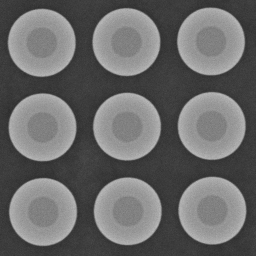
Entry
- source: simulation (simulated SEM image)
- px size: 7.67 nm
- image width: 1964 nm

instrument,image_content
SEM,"an array of small figures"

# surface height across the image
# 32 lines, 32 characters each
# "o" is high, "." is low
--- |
................................
....ooo.......oooo......oooo....
..oooooo.....oooooo....ooooooo..
.oooooooo...oooooooo...ooooooo..
.oooooooo...oooooooo..ooooooooo.
.oooooooo...oooooooo..ooooooooo.
.oooooooo...oooooooo..oooooooo..
..ooooooo...ooooooo....ooooooo..
..oooooo.....oooooo.....ooooo...
.....o..........................
................................
................................
...ooooo.....ooooo......ooooo...
..ooooooo...ooooooo....ooooooo..
.oooooooo...oooooooo..oooooooo..
.ooooooooo..oooooooo..ooooooooo.
.oooooooo...oooooooo..ooooooooo.
.oooooooo...oooooooo...ooooooo..
..ooooooo....oooooo....ooooooo..
...ooooo......oooo.......ooo....
................................
................................
....ooo.......oooo.......ooo....
..oooooo.....oooooo....ooooooo..
..ooooooo...oooooooo...ooooooo..
.oooooooo...oooooooo..ooooooooo.
.ooooooooo..oooooooo..ooooooooo.
.oooooooo...oooooooo...oooooooo.
..ooooooo...oooooooo...ooooooo..
..oooooo.....oooooo.....ooooo...
....ooo........oo...............
................................